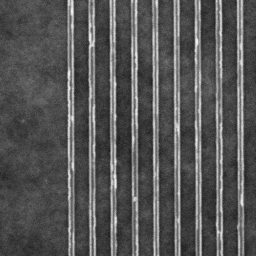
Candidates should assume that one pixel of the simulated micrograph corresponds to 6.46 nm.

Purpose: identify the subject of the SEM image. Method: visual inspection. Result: parallel lines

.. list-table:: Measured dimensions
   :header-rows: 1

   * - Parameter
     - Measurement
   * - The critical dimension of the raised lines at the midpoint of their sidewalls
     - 5.12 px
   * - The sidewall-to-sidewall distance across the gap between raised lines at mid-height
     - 15.4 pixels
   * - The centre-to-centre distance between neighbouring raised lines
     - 0.137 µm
